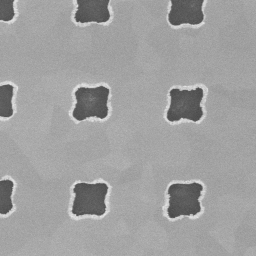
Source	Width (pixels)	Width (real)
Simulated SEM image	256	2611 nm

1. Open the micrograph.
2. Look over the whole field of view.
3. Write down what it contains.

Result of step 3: holes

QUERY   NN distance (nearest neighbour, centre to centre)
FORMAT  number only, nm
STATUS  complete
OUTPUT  961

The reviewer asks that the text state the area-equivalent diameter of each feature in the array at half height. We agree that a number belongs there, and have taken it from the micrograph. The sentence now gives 372 nm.